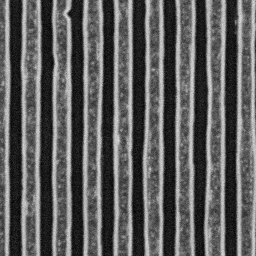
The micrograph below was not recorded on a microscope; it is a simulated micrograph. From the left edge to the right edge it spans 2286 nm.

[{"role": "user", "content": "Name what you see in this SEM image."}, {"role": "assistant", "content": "parallel lines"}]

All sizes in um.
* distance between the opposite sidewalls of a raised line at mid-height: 0.132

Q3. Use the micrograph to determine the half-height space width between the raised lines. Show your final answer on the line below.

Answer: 147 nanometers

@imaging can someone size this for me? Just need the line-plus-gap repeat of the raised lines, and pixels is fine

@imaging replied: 30.8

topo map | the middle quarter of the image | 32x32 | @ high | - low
@-----@@@----@@@@----@@@-----@@@
@-----@@@----@@@@----@@@----@@@@
@-----@@@----@@@@----@@@----@@@@
@-----@@@----@@@@----@@@-----@@@
@-----@@@----@@@@----@@@-----@@@
@-----@@@----@@@@----@@@-----@@@
@-----@@@----@@@@----@@@-----@@@
@-----@@@----@@@@----@@@-----@@@
@-----@@@----@@@@----@@@-----@@@
@-----@@@----@@@@----@@@-----@@@
@-----@@@----@@@@----@@@-----@@@
@-----@@@----@@@@----@@@-----@@@
@-----@@@----@@@@----@@@-----@@@
@-----@@@----@@@@----@@@-----@@@
@-----@@@----@@@@----@@@----@@@@
@-----@@@----@@@@----@@@----@@@@
@-----@@@----@@@@----@@@----@@@@
@-----@@@----@@@@----@@@----@@@@
@-----@@@----@@@@----@@@----@@@@
@-----@@@----@@@@----@@@----@@@@
@-----@@@----@@@@----@@@----@@@@
@----@@@@----@@@-----@@@----@@@@
@----@@@@----@@@----@@@@----@@@@
@----@@@@----@@@----@@@@----@@@@
@----@@@@----@@@@---@@@@----@@@@
@----@@@@----@@@@---@@@@-----@@@
@----@@@@----@@@@---@@@@-----@@@
@----@@@@----@@@@----@@@-----@@@
@----@@@@----@@@@---@@@@-----@@@
@----@@@@----@@@@---@@@@-----@@@
@----@@@@----@@@@---@@@@----@@@@
@----@@@@----@@@@---@@@@----@@@@